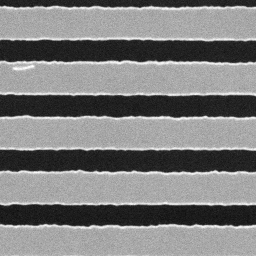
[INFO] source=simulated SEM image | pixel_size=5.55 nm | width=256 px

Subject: lines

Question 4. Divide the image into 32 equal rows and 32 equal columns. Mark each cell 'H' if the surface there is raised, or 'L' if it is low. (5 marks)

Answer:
LLLLLLLLLLLLLLLLLLLLLLLLLLLLLLLL
HHHHHHHHHHHHHHHHHHHHHHHHHHHHHHHH
HHHHHHHHHHHHHHHHHHHHHHHHHHHHHHHH
HHHHHHHHHHHHHHHHHHHHHHHHHHHHHHHH
HHHHHHHHHHHHHHHHHHHHHHHHHHHHHHHH
LLLLLLLLLLLLLLLLLLLLLLLLLLLLLLLL
LLLLLLLLLLLLLLLLLLLLLLLLLLLLLLLL
LLLLLLLLLLLLLLLLLLLLLLLLLLLLLLLL
HHHHHHHHHHHHHHHHHHHHHHHHHHHHHHHH
HHHHHHHHHHHHHHHHHHHHHHHHHHHHHHHH
HHHHHHHHHHHHHHHHHHHHHHHHHHHHHHHH
HHHHHHHHHHHHHHHHHHHHHHHHHHHHHHHH
LLLLLLLLLLLLLLLLLLLLLLLLLLLLLLLL
LLLLLLLLLLLLLLLLLLLLLLLLLLLLLLLL
LLLHLLLLLLLLLLLLLLLLLLLLLLLLLLLL
HHHHHHHHHHHHHHHHHHHHHHHHHHHHHHHH
HHHHHHHHHHHHHHHHHHHHHHHHHHHHHHHH
HHHHHHHHHHHHHHHHHHHHHHHHHHHHHHHH
HHHHHHHHHHHHHHHHHHHHHHHHHHHHHHHH
LLLLLLLLLLLLLLLLLLLLLLLLLLLLLLLL
LLLLLLLLLLLLLLLLLLLLLLLLLLLLLLLL
HHHHHHHHHHHHHHHHHHHHLLHLLHHHHHHL
HHHHHHHHHHHHHHHHHHHHHHHHHHHHHHHH
HHHHHHHHHHHHHHHHHHHHHHHHHHHHHHHH
HHHHHHHHHHHHHHHHHHHHHHHHHHHHHHHH
HHHHLHHHHHHHHHHHHHHHHHHHHHHHHHHH
LLLLLLLLLLLLLLLLLLLLLLLLLLLLLLLL
LLLLLLLLLLLLLLLLLLLLLLLLLLLLLLLL
HHHHHHHHHHHHHHHHHHHHHHHHHHHHHHHH
HHHHHHHHHHHHHHHHHHHHHHHHHHHHHHHH
HHHHHHHHHHHHHHHHHHHHHHHHHHHHHHHH
HHHHHHHHHHHHHHHHHHHHHHHHHHHHHHHH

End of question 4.